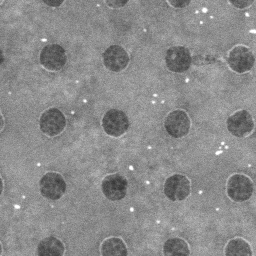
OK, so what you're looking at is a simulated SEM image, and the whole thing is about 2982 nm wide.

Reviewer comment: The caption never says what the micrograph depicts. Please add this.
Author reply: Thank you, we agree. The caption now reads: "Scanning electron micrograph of a regular array of raised bodies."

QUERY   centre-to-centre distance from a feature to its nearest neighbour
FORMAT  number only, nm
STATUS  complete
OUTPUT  726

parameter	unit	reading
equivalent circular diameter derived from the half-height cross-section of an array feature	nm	337